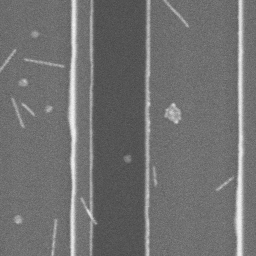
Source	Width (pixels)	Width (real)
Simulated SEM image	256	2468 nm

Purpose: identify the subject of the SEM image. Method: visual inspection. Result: lines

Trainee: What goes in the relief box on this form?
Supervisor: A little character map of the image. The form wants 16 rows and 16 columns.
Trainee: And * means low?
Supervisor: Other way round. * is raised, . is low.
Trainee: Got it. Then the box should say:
......***.......
......***.......
......***.......
......***.......
......***.......
......***.......
......***.......
......***.......
......***.......
......***.......
......***.......
......***.......
......***.......
......***.......
......***.......
......***.......